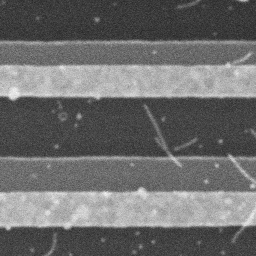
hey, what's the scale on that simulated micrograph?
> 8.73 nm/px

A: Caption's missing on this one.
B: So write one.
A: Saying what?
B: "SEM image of lines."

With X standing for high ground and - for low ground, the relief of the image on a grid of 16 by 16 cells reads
----------------
----------------
----------------
XXXXXXXXXXXXXXXX
XXXXXXXXXXXXXXXX
XXXXXXXXXXXXXXXX
----------------
----------------
----------------
----------------
XXXXXXXXXXXXXXXX
XXXXXXXXXXXXXXXX
XXXXXXXXXXXXXXXX
XXXXXXXXXXXXXXXX
----------------
----------------